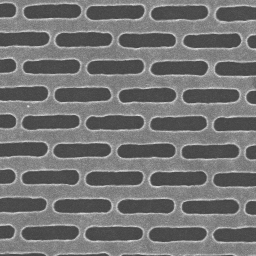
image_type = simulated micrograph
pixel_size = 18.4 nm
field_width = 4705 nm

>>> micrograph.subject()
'a regular array of holes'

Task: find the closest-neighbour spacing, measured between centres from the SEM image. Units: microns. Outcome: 0.768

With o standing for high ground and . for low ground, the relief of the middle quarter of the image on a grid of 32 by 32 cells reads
....oo..............oo..........
....oo..............oo..........
..ooooo.oo........oooo..........
oooooooooooooooooooooooooooooooo
oooooooooooooooooooooooooooooooo
oooooooooooooooooooooooooooooooo
...........oooo............oooo.
............oo..............oo..
............oo..............oo..
.....oooooooooo............ooo..
oooooooooooooooooooooooooooooooo
oooooooooooooooooooooooooooooooo
oooooooooooooooooooooooooooooooo
....oo..............ooo.........
....o...............oo..........
...ooo..............oo..........
ooooooooooooo.....oooo..........
oooooooooooooooooooooooooooooooo
oooooooooooooooooooooooooooooooo
oooooooooooooooooooooooooooooooo
...........ooo.............ooo..
............o...............o...
...........oo...............o...
.oooooooooooooo.......oooooooo..
oooooooooooooooooooooooooooooooo
oooooooooooooooooooooooooooooooo
...ooooooooooooooooooooooooooooo
....oo..............oo..........
....oo..............oo..........
...oo..............oo...........
oooooooooo....ooooooooo..o.ooooo
oooooooooooooooooooooooooooooooo